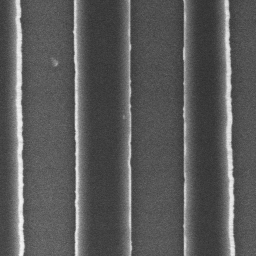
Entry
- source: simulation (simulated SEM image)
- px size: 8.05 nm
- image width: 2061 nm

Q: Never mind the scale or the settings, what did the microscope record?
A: lines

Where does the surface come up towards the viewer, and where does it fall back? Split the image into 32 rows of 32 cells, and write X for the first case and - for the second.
XX-------XXXXXXX-------XXXXX----
XX-------XXXXXXX-------XXXXX----
XX-------XXXXXXX-------XXXXXX---
XX-------XXXXXXX-------XXXXX----
XXX------XXXXXXX-------XXXXXX---
XX-------XXXXXXX-------XXXXXX---
XX-------XXXXXXX-------XXXXXX---
XXX------XXXXXXX-------XXXXXX---
XX-------XXXXXXX-------XXXXXX---
XXX------XXXXXXX-------XXXXXX---
XX-------XXXXXXX-------XXXXXX---
XX-------XXXXXXX-------XXXXXX---
XX-------XXXXXXX-------XXXXXX---
XX-------XXXXXXX-------XXXXXX---
XXX------XXXXXXX-------XXXXXX---
XXX------XXXXXXX-------XXXXXX---
XXX------XXXXXXX-------XXXXXX---
XXX------XXXXXXX-------XXXXXX---
XXX-------XXXXXX-------XXXXXX---
XXX-------XXXXXX-------XXXXXX---
XXX-------XXXXXX-------XXXXXX---
XXX-------XXXXXX-------XXXXXX---
XXX-------XXXXXX-------XXXXXX---
XXX-------XXXXXX-------XXXXXX---
XXX-------XXXXXX-------XXXXXX---
XXX------XXXXXXX-------XXXXXX---
XXX-------XXXXXX-------XXXXXX---
XXX-------XXXXXX-------XXXXXX---
XXX-------XXXXXX-------XXXXXX---
XXX------XXXXXXX-------XXXXXX---
XXX------XXXXXXX-------XXXXXX---
XXX------XXXXXXX-------XXXXXX---